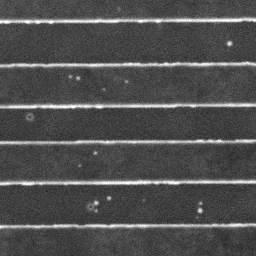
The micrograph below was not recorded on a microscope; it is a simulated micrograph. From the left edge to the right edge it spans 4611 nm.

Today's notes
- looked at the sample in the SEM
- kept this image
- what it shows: lines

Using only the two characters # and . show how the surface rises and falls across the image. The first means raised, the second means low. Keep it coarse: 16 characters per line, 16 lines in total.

################
................
................
................
################
################
################
................
................
################
################
##..............
................
................
################
################